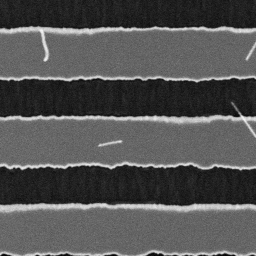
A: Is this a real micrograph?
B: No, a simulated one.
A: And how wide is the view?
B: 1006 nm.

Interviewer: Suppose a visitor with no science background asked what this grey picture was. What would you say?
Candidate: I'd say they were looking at lines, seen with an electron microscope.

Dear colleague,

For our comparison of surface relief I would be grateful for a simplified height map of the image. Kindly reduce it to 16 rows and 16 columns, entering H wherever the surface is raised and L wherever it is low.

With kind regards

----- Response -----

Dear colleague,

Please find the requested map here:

LLLLLLLLLLLLLLLL
LLLLLLLLLLLLLLLL
HHHHHHHHHHHHHHHH
HHHHHHHHHHHHHHHH
HHHHHHHHHHHHHHHH
LLLLLLLLLLLLLLLL
LLLLLLLLLLLLLLLL
HHHHHHHHHHHHHHHH
HHHHHHHHHHHHHHHH
HHHHHHHHHHHHHHHH
LHLLLLLLLLLLHLHH
LLLLLLLLLLLLLLLL
LLLLLLLLLLLLLLLL
HHHHHHHHHHHHHHHH
HHHHHHHHHHHHHHHH
HHHHHHHHHHHHHHHH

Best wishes